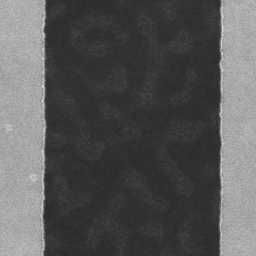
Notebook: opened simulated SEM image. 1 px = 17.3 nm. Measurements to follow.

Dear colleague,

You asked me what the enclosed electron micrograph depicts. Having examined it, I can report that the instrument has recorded one or a few lines or trenches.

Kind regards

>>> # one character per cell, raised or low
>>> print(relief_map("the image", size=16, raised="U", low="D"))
DDDUUUUUUUUUUUDD
DDDUUUUUUUUUUUDD
DDDUUUUUUUUUUUDD
DDDUUUUUUUUUUUDD
DDDUUUUUUUUUUUDD
DDDUUUUUUUUUUUDD
DDDUUUUUUUUUUUDD
DDDUUUUUUUUUUUDD
DDDUUUUUUUUUUUDD
DDDUUUUUUUUUUUDD
DDDUUUUUUUUUUUDD
DDDUUUUUDUUUUUDD
DDDUUUUUUUUUUUDD
DDDUUUUUUUUUUUDD
DDDUUUUUUUUUUUDD
DDDUUUUUUUUUUUDD